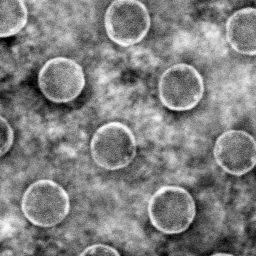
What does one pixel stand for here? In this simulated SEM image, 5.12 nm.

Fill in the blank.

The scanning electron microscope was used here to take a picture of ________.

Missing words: raised bodies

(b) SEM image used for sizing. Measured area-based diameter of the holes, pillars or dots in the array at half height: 0.23 um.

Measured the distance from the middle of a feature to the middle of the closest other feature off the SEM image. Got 86.4 pixels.